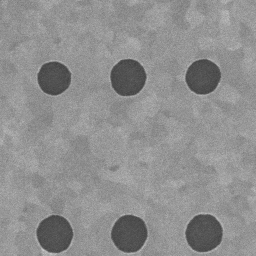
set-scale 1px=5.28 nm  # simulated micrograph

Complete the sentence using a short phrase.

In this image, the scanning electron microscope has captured holes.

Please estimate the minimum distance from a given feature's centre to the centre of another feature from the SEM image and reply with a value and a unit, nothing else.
0.394 micrometres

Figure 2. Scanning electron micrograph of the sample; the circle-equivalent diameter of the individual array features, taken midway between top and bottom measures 199 nanometers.